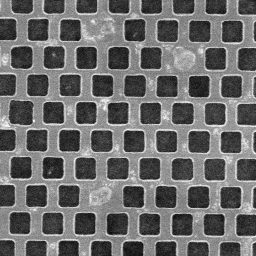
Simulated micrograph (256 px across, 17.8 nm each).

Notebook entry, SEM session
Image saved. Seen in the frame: a regular array of holes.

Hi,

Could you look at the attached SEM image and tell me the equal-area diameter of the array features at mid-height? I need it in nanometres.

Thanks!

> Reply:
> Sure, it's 430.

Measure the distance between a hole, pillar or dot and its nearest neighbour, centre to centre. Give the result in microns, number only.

0.565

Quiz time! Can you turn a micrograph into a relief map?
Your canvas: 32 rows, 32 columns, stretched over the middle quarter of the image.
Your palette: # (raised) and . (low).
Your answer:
###.....###.....###.....########
############...#####...#########
################################
....###.....###.....###.....###.
....###.....###......##......##.
....###.....###......##......##.
....###.....###......##......##.
....###.....###.....###......##.
################################
####...#####....################
###.....###.....###.....###.....
###.....###.....###.....###.....
###.....###.....###.....###.....
###.....###.....###.....###.....
###.....###.....###.....###.....
################################
...####.....####################
....###.....###.....###.....###.
....###.....###.....###.....###.
....###.....###.....###.....###.
....###.....###.....###.....###.
....###.....###.....###.....###.
################################
###....#####...#####...#####...#
###.....###.....###.....###.....
###.....###.....###.....###.....
###.....###.....###.....###.....
###.....###.....###.....###.....
###.....###.....###.....###.....
################################
....############...#####....####
....###########.....###.....###.